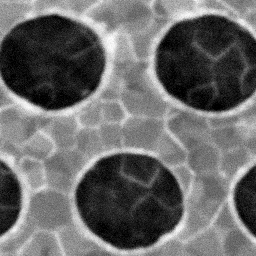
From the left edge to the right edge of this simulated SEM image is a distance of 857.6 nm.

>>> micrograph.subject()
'holes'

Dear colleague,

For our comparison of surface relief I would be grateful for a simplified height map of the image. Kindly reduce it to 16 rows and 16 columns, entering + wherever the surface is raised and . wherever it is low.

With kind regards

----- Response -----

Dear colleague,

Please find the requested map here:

++++++++++++++++
+....++++++....+
......++++......
.......+++......
.......+++......
+.....++++......
++...++++++....+
++++++++++++++++
++++++++++++++++
++++++++++++++++
.+++++....++++++
.++++......++++.
.++++.......+++.
.++++......++++.
++++++.....+++++
+++++++..+++++++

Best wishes